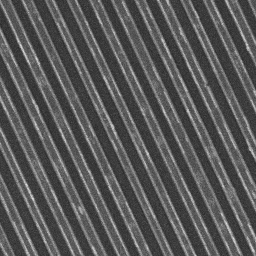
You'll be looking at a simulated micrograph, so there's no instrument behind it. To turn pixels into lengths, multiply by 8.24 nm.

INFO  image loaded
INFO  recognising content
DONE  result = parallel lines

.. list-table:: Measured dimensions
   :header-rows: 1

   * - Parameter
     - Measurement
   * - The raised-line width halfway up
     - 0.0813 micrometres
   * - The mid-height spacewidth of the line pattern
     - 89.6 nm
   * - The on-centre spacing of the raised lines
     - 20.5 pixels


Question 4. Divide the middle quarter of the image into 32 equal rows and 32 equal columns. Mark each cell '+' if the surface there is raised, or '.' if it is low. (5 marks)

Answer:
...++....++...+++...++....++...+
....++...++...+++...+++...++...+
+...++...+++...+++..+++...+++...
+...+++...++...+++...+++...++...
++...++...+++...+++..+++...+++..
++...+++...++...+++...+++...++..
++....++...+++...++...+++...+++.
.++...++....++...+++...+++...++.
.++....++...+++...++...+++...+++
.+++...++....++...+++...+++...++
..++....++...+++...++...+++...++
..+++...++....++...+++...+++...+
...++....++...+++...++...+++...+
...+++...++....++...+++...++....
+...++....++...++....++...+++...
+...+++...++....++...+++...++...
++...++....++...++....++...+++..
++...+++...++...+++...+++..+++..
+++..+++...+++...++...+++...+++.
+++...+++...++...+++...+++..+++.
.+++..+++...+++...++...+++...+++
.+++...++....++...+++...++...+++
..++...+++...++....++...+++...++
..+++...++....++...+++...++...++
...++...+++...++....++...+++...+
...+++...++....++...+++...++...+
+..+++...+++...++....++...+++...
+...+++...++....++...+++...++...
++..+++...+++...++....++...+++..
++...+++...++....++...++....++..
++...+++...+++...++....++...+++.
+++...+++...++....++...++....++.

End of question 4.